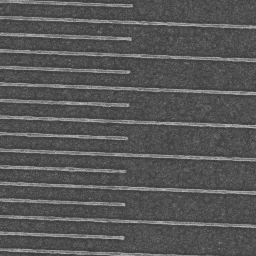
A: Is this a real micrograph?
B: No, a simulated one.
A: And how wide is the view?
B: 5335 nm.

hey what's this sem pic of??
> parallel lines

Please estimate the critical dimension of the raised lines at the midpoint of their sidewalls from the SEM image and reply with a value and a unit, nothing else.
62.5 nm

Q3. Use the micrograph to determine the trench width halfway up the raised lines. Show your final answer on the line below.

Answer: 13.7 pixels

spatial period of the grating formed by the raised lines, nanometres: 346